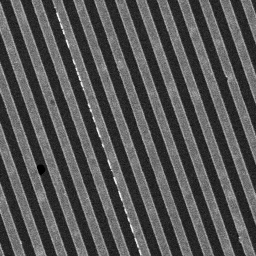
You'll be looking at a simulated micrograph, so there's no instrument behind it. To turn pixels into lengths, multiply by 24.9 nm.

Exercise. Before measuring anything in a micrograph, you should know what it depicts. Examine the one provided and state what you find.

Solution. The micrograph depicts parallel lines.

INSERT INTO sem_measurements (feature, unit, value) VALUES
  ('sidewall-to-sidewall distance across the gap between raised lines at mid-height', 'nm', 292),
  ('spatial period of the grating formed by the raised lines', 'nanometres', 494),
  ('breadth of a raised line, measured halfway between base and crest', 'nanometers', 209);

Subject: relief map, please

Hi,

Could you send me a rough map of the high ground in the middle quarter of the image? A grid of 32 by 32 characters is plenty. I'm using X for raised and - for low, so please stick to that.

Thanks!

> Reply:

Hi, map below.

---XX---XX---XXX---XX---XX---XX-
---XX----XX---XX---XX---XX---XXX
X---XX---XX---XX---XXX---XX---XX
X---XX---XX---XXX---XX---XX---XX
X---XX----XX---XX---XX---XXX--XX
XX---XX---XX---XX---XXX---XX---X
XX---XX---XX---XXX---XX---XX---X
XX---XXX---XX---XX---XX---XXX--X
XXX---XX---XX---XXX--XXX---XX---
-XX---XX---XXX--XXX---XX---XX---
-XX---XXX---XX---XX---XX---XXX--
-XXX---XX---XX---XXX--XXX---XX--
--XX---XX---XXX--XXX---XX---XX--
--XX---XXX---XX---XX---XX---XXX-
---XX---XX---XX---XXX--XXX---XX-
---XX---XX---XXX---XX---XX---XX-
---XXX--XXX---XX---XX---XX---XXX
X--XXX---XX---XX---XXX---XX---XX
X---XX---XX---XXX---XX---XX---XX
X---XXX--XXX---XX---XX---XX----X
XX---XX---XX---XX---XXX---XX---X
XX---XX---XX----XX---XX---XX---X
XX---XXX---XX---XX---XX---XX----
XXX---XX---XX---XX---XXX---XX---
-XX---XX---XX----XX---XX---XX---
-XX---XXX---XX---XX---XX---XXX--
--XX---XX---XX---XX---XXX---XX--
--XX---XX---XX----XX---XX---XX--
--XX---XXX---XX---XX---XX---XXX-
---XX---XX---XX---XX---XXX---XX-
---XX---XX---XXX---XX---XX---XX-
---XX---XXX---XX---XX---XX---XXX